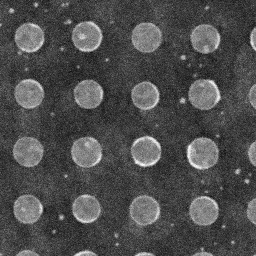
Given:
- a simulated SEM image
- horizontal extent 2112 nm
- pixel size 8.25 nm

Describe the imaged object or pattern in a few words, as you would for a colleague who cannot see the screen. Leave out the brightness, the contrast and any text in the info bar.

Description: a regular array of raised bodies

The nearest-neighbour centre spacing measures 468 nanometres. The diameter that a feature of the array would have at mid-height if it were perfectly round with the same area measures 0.238 µm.